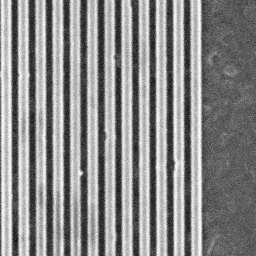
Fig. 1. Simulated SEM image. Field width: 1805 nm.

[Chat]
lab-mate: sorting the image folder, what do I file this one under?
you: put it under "parallel lines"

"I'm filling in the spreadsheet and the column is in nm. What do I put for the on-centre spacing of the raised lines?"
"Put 122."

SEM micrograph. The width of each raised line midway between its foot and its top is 0.0573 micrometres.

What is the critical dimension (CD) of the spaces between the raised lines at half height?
0.0634 microns